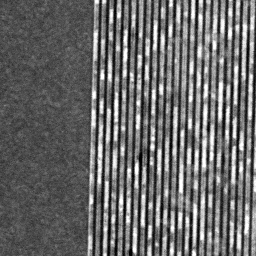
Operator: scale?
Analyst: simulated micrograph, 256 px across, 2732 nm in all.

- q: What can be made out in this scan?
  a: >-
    parallel lines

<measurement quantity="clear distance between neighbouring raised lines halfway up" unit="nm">49.3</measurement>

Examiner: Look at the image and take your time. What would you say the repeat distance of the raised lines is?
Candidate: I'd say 79.3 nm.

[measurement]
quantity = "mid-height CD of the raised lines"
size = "0.0307 um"